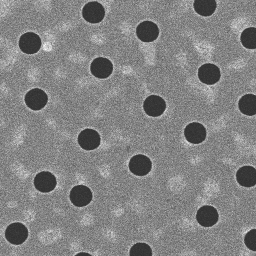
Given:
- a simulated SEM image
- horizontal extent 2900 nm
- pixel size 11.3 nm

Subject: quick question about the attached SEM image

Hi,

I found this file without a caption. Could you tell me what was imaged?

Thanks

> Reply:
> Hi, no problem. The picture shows a regular array of holes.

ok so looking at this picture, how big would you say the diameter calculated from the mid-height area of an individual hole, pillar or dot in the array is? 255 nm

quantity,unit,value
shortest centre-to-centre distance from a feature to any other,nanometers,640